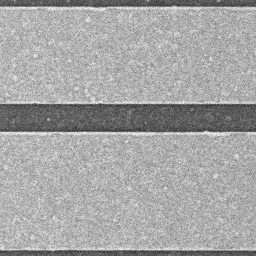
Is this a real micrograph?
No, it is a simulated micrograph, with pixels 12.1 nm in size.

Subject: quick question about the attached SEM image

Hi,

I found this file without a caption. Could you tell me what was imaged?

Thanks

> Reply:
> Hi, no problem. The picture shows one or a few lines or trenches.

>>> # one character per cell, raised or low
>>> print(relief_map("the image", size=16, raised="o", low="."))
oooooooooooo....
oooooooooooooooo
oooooooooooooooo
oooooooooooooooo
oooooooooooooooo
oooooooooooooooo
................
................
oooooooooooooooo
oooooooooooooooo
oooooooooooooooo
oooooooooooooooo
oooooooooooooooo
oooooooooooooooo
oooooooooooooooo
oooooooooooooooo